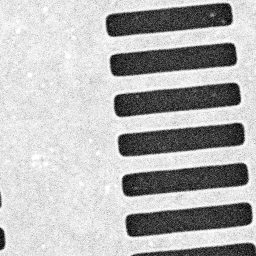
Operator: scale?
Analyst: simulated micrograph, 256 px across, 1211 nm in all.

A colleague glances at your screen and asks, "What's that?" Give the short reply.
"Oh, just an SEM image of groups of lines, slits or small figures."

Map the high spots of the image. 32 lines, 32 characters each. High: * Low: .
*************************....***
***************..............***
*************................***
*************..............*****
**************..****************
**************************...***
****************..............**
**************................**
**************..............****
**************...***************
*************************.....**
*****************.............**
**************................**
**************.............*****
**************....**************
***************************...**
****************...............*
***************................*
***************.............****
***************....*************
****************************...*
*****************..............*
***************................*
***************..............***
****************..**************
****************************...*
******************..............
****************................
****************..............**
.***************....************
.***************************....
******************..............